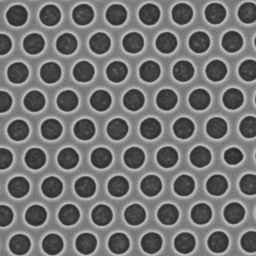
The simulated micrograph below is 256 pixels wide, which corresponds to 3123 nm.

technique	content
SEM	a regular array of holes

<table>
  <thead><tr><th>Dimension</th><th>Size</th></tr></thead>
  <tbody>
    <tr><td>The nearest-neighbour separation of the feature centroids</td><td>400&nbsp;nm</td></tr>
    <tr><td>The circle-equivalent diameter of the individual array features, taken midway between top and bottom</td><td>0.27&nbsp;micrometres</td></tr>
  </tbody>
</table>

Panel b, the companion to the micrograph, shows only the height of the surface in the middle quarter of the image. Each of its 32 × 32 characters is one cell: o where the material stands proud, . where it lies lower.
ooo....oooo.....ooo.....ooo.....
oo......ooo.....ooo.....ooo.....
oo.....oooo.....ooo.....ooo.....
ooo....oooo....oooo.....oooo....
oooo..oooooo..ooooooo.ooooooo.oo
oooooooooooooooooooooooooooooooo
..oooooo..oooooo...ooooo...ooooo
...oooo....oooo.....ooo.....ooo.
....ooo.....ooo.....ooo.....ooo.
....oo......ooo.....ooo.....ooo.
...oooo.....ooo.....ooo.....ooo.
..oooooo...ooooo...oooooo..ooooo
oooooooooooooooooooooooooooooooo
ooooooooooooo.ooooooo.ooooooo..o
ooo....oooo.....ooo.....oooo....
oo......ooo.....ooo.....ooo.....
oo......oo......ooo......oo.....
ooo.....ooo.....ooo.....oooo....
ooo....ooooo...ooooo...oooooo..o
oooooooooooooooooooooooooooooooo
oooooooooooooooooooooooooooooooo
...oooo....ooooo...ooooo....oooo
....ooo.....ooo.....ooo......oo.
....ooo.....ooo.....ooo......oo.
....ooo.....ooo.....ooo.....oooo
...ooooo...ooooo...ooooo...ooooo
oooooooooooooooooooooooooooooooo
oooooooooooooooooooooooooooooooo
oooo...ooooo...ooooo....oooo....
ooo.....ooo.....ooo.....ooo.....
oo......ooo.....ooo......oo.....
ooo.....ooo.....ooo.....oooo....